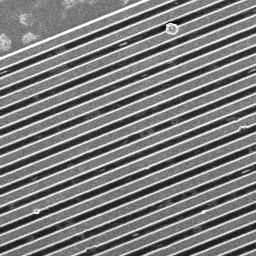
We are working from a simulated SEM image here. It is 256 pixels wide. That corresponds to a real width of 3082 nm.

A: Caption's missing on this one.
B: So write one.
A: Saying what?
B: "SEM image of parallel lines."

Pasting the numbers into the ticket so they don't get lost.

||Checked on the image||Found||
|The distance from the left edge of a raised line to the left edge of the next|219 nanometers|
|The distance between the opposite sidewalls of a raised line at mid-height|130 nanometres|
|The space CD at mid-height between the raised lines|86.6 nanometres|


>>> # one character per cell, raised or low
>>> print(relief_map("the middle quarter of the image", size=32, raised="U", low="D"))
DDDDUUUUUUUDDDDDUUUUUUUDDDDDUUUU
DUUUUUUUDDDDDUUUUUUUDDDDDUUUUUUU
UUUUUUDDDDDUUUUUUUDDDDDUUUUUUUDD
UUUDDDDDUUUUUUUUDDDDUUUUUUUUDDDD
UDDDDDUUUUUUUDDDDDUUUUUUUDDDDDUU
DDDUUUUUUUUDDDDUUUUUUUUDDDDUUUUU
DUUUUUUUDDDDDUUUUUUUDDDDDUUUUUUU
UUUUUUDDDDUUUUUUUUDDDDUUUUUUUUDD
UUUDDDDDUUUUUUUDDDDDUUUUUUUUDDDD
UDDDDUUUUUUUUDDDDDUUUUUUUDDDDDUU
DDDUUUUUUUDDDDDUUUUUUUUDDDDDUUUU
DUUUUUUUDDDDDUUUUUUUDDDDDUUUUUUU
UUUUUDDDDDUUUUUUUUDDDDDUUUUUUUDD
UUUDDDDDUUUUUUUDDDDDUUUUUUUDDDDD
DDDDDUUUUUUUUDDDDDUUUUUUUDDDDDUU
DDDUUUUUUUDDDDDUUUUUUUDDDDDUUUUU
UUUUUUUUDDDDDUUUUUUUDDDDDUUUUUUU
UUUUUDDDDDUUUUUUUDDDDDUUUUUUUDDD
UUDDDDDDUUUUUUUDDDDDUUUUUUUDDDDD
DDDDDUUUUUUUDDDDDUUUUUUUDDDDDDUU
DDDUUUUUUUDDDDDUUUUUUUDDDDDUUUUU
UUUUUUUDDDDDUUUUUUUDDDDDDUUUUUUU
UUUUUDDDDDUUUUUUUDDDDDUUUUUUUDDD
UUDDDDDUUUUUUUDDDDDDUUUUUUUDDDDD
DDDDDUUUUUUUDDDDDUUUUUUUDDDDDUUU
DDUUUUUUUDDDDDDUUUUUUUDDDDDUUUUU
UUUUUUUDDDDDUUUUUUUDDDDDUUUUUUUD
UUUUDDDDDDUUUUUUUDDDDDUUUUUUUDDD
UUDDDDDUUUUUUUUDDDDUUUUUUUUDDDDU
DDDDDUUUUUUUDDDDDUUUUUUUDDDDDUUU
DDUUUUUUUUDDDDUUUUUUUUDDDDUUUUUU
UUUUUUUDDDDDUUUUUUUDDDDDUUUUUUUD